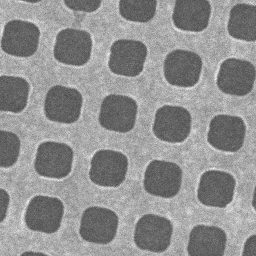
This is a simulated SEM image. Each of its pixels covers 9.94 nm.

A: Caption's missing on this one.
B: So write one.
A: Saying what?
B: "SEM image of a regular array of holes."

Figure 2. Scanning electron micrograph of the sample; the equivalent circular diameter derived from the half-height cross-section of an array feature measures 395 nm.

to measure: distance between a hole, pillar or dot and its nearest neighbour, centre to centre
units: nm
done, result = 549